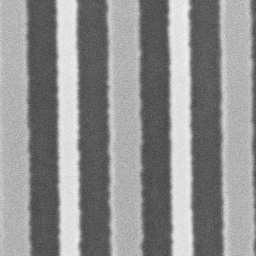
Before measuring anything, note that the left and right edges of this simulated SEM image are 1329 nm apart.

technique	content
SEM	lines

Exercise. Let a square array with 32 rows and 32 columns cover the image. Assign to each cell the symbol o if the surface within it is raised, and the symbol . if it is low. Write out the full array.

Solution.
ooo....ooo....ooo....ooo....ooo.
ooo....ooo....ooo....ooo....ooo.
ooo....ooo...oooo....ooo....ooo.
ooo....ooo....ooo....ooo....ooo.
ooo....ooo....ooo....ooo....ooo.
ooo....ooo....ooo....ooo....ooo.
ooo....ooo....oooo...ooo....ooo.
ooo....ooo....ooo....ooo....ooo.
ooo....ooo....ooo....ooo....ooo.
ooo....ooo....ooo....ooo....ooo.
ooo....ooo....ooo....ooo....ooo.
ooo....ooo....ooo....ooo....ooo.
ooo....ooo....ooo....ooo....ooo.
ooo....ooo....oooo...ooo....ooo.
ooo....ooo....ooo....ooo....ooo.
ooo....ooo....oooo...ooo....ooo.
oooo...ooo....oooo...ooo....oooo
oooo...ooo....oooo...ooo....ooo.
ooo....ooo....oooo...ooo....ooo.
oooo...ooo....oooo...ooo....oooo
oooo...ooo....oooo...ooo....oooo
oooo...ooo....oooo...ooo....oooo
oooo...ooo....oooo...ooo....oooo
oooo...ooo....oooo...ooo....oooo
oooo...ooo....oooo...ooo....oooo
oooo....oo....oooo....oo....oooo
oooo...ooo....oooo....oo....oooo
oooo....oo....oooo....oo....oooo
oooo....oo....oooo....oo....oooo
oooo...ooo....oooo....oo....oooo
oooo....oo....oooo....oo....oooo
oooo....oo....oooo....oo....oooo